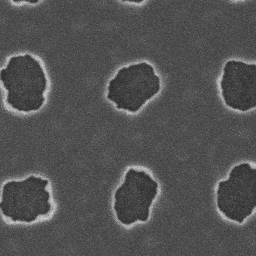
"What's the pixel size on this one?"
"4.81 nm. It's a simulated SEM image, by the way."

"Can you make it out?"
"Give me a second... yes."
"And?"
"holes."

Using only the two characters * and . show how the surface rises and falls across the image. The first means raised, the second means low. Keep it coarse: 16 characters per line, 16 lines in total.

****************
****************
****************
*.**************
...****...****..
...****...****..
*..****..*****..
****************
****************
****************
***************.
...*****..****..
...****...****..
...****..*****..
****************
****************